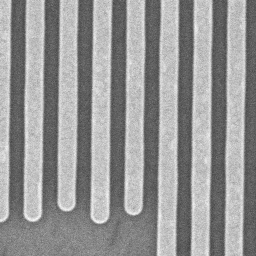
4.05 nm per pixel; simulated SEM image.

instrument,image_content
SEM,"groups of lines, slits or small figures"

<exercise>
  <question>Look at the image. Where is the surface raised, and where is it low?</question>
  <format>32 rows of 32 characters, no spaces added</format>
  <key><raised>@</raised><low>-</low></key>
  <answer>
@--@@---@@--@@--@@--@@--@@---@@-
@--@@---@@--@@--@@--@@--@@---@@-
@--@@---@@--@@--@@--@@--@@---@@-
@--@@---@@--@@--@@--@@--@@---@@-
@--@@---@@--@@--@@--@@--@@---@@-
@--@@---@@--@@--@@--@@--@@---@@-
@--@@---@@--@@--@@--@@--@@---@@-
@--@@---@@--@@--@@--@@--@@--@@@-
@--@@--@@@--@@--@@--@@--@@--@@@-
@--@@--@@@--@@--@@--@@--@@--@@@-
@--@@--@@@--@@--@@--@@--@@--@@@-
@--@@--@@@--@@--@@--@@--@@--@@@-
@--@@--@@@--@@--@@--@@--@@--@@--
@--@@--@@@--@@--@@--@@--@@--@@--
@--@@--@@@--@@--@@--@@--@@--@@--
@--@@--@@@--@@--@@--@@--@@--@@--
@--@@--@@---@@--@@--@@--@@--@@--
@--@@--@@---@@--@@--@@--@@--@@--
@--@@--@@---@@--@@--@@--@@--@@--
@--@@--@@---@@--@@--@@--@@--@@--
@--@@--@@---@@--@@--@@--@@--@@--
@--@@--@@---@@--@@--@@--@@--@@--
@--@@--@@---@@--@@--@@--@@--@@--
@--@@--@@---@@--@@--@@--@@--@@--
@--@@--@@---@@--@@--@@--@@--@@--
@--@@--@@---@@--@@--@@--@@--@@--
@--@@-------@@--@---@@--@@--@@--
------------@-------@@--@@--@@--
--------------------@@--@@--@@--
--------------------@@--@@--@@--
--------------------@@--@@--@@--
--------------------@@--@@--@@--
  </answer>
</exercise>